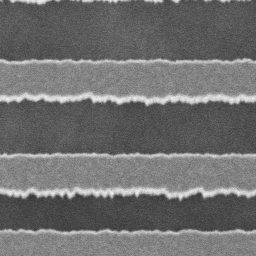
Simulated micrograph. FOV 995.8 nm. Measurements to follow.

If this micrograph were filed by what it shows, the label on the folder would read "lines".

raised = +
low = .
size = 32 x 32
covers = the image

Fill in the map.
................................
................................
................................
................................
................................
................................
................................
........+..........++.........+.
++++++++++++++++++++++++++++++++
++++++++++++++++++++++++++++++++
++++++++++++++++++++++++++++++++
++++++++++++++++++++++++++++++++
+++.+.++++..+.++++++++++++..++++
................................
................................
................................
................................
................................
................................
++++++++++++++++++++++++++++++++
++++++++++++++++++++++++++++++++
++++++++++++++++++++++++++++++++
++++++++++++++++++++++++++++++++
++++++++++++++++++++++++++++++++
..+..+..+............+++........
................................
................................
................................
................................
++++++++++++++++++++++++++++++++
++++++++++++++++++++++++++++++++
++++++++++++++++++++++++++++++++